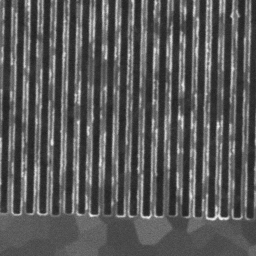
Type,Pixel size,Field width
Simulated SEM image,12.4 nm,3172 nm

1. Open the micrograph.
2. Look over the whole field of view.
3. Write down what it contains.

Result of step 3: parallel lines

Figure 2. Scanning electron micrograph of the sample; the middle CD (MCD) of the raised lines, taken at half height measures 5.63 px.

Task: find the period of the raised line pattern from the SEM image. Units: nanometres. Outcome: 161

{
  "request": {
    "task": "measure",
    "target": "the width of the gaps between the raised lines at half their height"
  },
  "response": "92.9 nm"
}